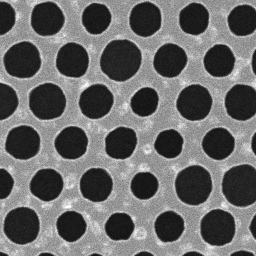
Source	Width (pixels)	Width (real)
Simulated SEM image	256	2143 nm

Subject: a regular array of holes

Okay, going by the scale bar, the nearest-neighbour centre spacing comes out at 400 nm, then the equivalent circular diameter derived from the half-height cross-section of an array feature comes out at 0.279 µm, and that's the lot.